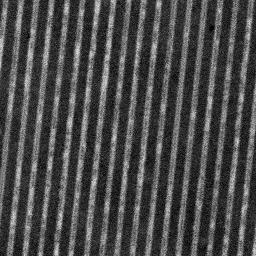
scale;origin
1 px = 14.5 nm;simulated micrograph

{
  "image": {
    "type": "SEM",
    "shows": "parallel lines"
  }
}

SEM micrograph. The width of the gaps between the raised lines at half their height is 11.6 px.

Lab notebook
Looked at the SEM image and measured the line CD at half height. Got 52.2 nanometres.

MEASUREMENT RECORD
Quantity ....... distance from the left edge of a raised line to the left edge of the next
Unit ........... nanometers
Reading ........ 221